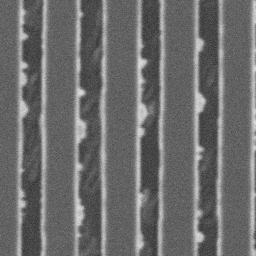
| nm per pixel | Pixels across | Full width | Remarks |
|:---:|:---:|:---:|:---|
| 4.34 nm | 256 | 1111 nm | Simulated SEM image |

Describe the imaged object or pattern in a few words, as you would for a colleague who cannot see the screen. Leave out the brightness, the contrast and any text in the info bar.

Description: lines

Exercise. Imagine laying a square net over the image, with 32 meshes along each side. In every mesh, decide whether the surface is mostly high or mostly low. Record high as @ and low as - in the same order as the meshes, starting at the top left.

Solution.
@@@--@@@@@---@@@@@--@@@@@---@@@@
@@@--@@@@@---@@@@@--@@@@@---@@@@
@@@--@@@@@---@@@@@--@@@@@---@@@@
@@@--@@@@@---@@@@@--@@@@@---@@@@
@@@--@@@@@---@@@@@--@@@@@---@@@@
@@@--@@@@@---@@@@@--@@@@@---@@@@
@@@--@@@@@---@@@@---@@@@@---@@@@
@@@--@@@@@---@@@@@--@@@@@---@@@@
@@@--@@@@@---@@@@@--@@@@@---@@@@
@@@--@@@@@---@@@@@--@@@@@---@@@@
@@@--@@@@@---@@@@@--@@@@@---@@@@
@@@--@@@@@---@@@@@--@@@@@---@@@@
@@@--@@@@@---@@@@@--@@@@@---@@@@
@@@--@@@@@---@@@@@--@@@@@---@@@@
@@@--@@@@@---@@@@---@@@@@---@@@@
@@@--@@@@@---@@@@---@@@@@--@@@@@
@@@--@@@@@---@@@@---@@@@@--@@@@@
@@@--@@@@@---@@@@---@@@@@--@@@@@
@@@--@@@@@---@@@@---@@@@@--@@@@@
@@@--@@@@@---@@@@---@@@@@--@@@@@
@@@--@@@@@---@@@@---@@@@@--@@@@@
@@@--@@@@@---@@@@---@@@@@--@@@@@
@@@--@@@@@---@@@@---@@@@@--@@@@@
@@@--@@@@@---@@@@---@@@@@--@@@@@
@@@--@@@@@---@@@@---@@@@@--@@@@@
@@@--@@@@@---@@@@---@@@@@--@@@@@
@@@--@@@@@---@@@@---@@@@@--@@@@@
@@@--@@@@@---@@@@---@@@@@--@@@@@
@@@--@@@@@---@@@@---@@@@@--@@@@@
@@@--@@@@@---@@@@---@@@@@--@@@@@
@@@--@@@@@---@@@@---@@@@@--@@@@@
@@@--@@@@@---@@@@---@@@@@--@@@@@